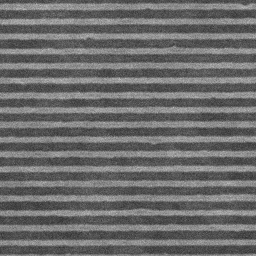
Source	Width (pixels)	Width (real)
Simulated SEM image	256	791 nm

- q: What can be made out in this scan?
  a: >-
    parallel lines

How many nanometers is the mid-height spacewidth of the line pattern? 28.9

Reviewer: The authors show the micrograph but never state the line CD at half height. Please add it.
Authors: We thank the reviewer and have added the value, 5.73 px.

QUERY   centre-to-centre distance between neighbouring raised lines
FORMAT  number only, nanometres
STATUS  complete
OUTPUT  45.5